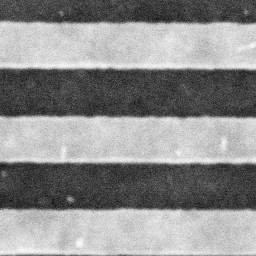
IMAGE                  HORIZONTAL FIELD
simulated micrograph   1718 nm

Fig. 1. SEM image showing lines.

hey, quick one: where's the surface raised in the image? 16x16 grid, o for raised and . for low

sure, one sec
................
ooo.o.ooooo..oo.
oooooooooooooooo
oooooooooooooooo
................
................
................
oooooooooooooooo
oooooooooooooooo
oooooooooooooooo
................
................
................
oooooooooooooooo
oooooooooooooooo
oooooooooooooooo